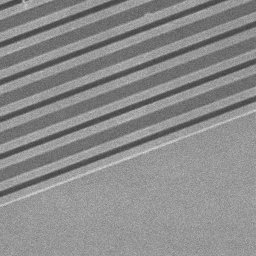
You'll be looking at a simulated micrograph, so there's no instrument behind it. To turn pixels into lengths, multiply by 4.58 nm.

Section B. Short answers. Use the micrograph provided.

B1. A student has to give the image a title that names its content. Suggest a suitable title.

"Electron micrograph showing parallel lines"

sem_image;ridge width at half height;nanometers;38.1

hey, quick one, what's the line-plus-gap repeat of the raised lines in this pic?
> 78.8 nm